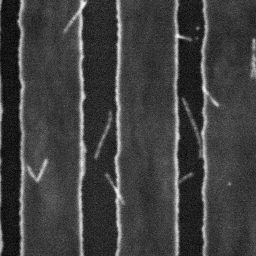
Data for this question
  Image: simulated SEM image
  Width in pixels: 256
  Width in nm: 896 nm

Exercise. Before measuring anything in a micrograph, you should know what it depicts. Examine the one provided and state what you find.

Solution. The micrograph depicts lines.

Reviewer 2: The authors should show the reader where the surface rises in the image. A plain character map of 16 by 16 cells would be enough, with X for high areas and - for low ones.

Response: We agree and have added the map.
-XXXX--XXXX--XXX
-XXXX--XXXX--XXX
-XXXX--XXXX--XXX
-XXXX--XXXX--XXX
-XXXX--XXXX--XXX
-XXXX--XXXX--XXX
-XXXX--XXXX--XXX
-XXXX--XXXX--XXX
-XXXX--XXXX--XXX
-XXXX--XXXX--XXX
-XXXX--XXXX--XXX
-XXXX--XXXX--XXX
-XXXX--XXXX--XXX
-XXXX--XXXX--XXX
-XXXX--XXXX--XXX
-XXXX--XXXX--XXX